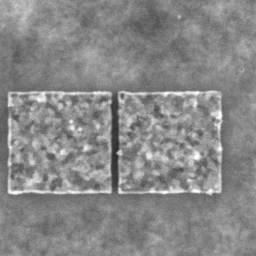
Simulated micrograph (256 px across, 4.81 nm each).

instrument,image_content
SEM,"wiring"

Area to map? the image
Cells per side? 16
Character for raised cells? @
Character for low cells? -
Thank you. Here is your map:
----------------
----------------
----------------
----------------
----------------
----------------
-@@@@@@@@@@@@@--
-@@@@@@@@@@@@@--
-@@@@@@@@@@@@@--
-@@@@@@@@@@@@@--
-@@@@@@@@@@@@@--
-@@@@@@@@@@@@@--
----------------
----------------
----------------
----------------